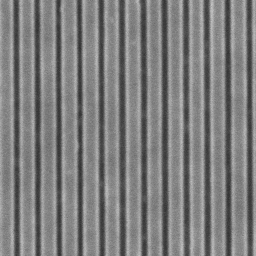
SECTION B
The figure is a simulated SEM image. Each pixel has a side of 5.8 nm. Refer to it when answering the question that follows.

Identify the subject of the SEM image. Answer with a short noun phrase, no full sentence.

parallel lines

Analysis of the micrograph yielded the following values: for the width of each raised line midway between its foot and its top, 81.2 nm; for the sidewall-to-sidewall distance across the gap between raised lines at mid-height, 40.6 nm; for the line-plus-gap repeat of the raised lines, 0.123 micrometres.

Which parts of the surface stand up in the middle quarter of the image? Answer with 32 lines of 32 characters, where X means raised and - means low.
XXX--XXX--XXX---XXX--XXX--XXXX--
XXX--XXX--XXX---XXX--XXX--XXXX--
XXX--XXX--XXX---XXX--XXX--XXXX--
XXX--XXX--XXX---XXX--XXX--XXXX--
XXX--XXX--XXX---XXX--XXX--XXXX--
XXX--XXX--XXX---XXX--XXX--XXXX--
XXX--XXX--XXX---XXX--XXX--XXXX--
XXX--XXX--XXX---XXX--XXX--XXXX--
XXX--XXX--XXX---XXX--XXX--XXXX--
XXX--XXX--XXX---XXX--XXX--XXXX--
XXX--XXX--XXX---XXX--XXX--XXXX--
XXX--XXX--XXX---XXX--XXX--XXXX--
XXX--XXX--XXX---XXX--XXX--XXXX--
XXX--XXX--XXX---XXX--XXX--XXXX--
XXX--XXX--XXX---XXX--XXX--XXXX--
XXX--XXX--XXX---XXX--XXX--XXXX--
XXX--XXX--XXX---XXX--XXX--XXXX--
XXX--XXX--XXX---XXX--XXX--XXXX--
XXX--XXX--XXX---XXX--XXX--XXXX--
XXX--XXX--XXX---XXX--XXX--XXXX--
XXX--XXX--XXX---XXX--XXX--XXXX--
XXX--XXX--XXX---XXX--XXX--XXXX--
XXX--XXX--XXXX--XXX--XXX--XXXX--
XXX--XXX--XXXX--XXX--XXX--XXXX--
XXX--XXXX-XXXX--XXX--XXX--XXXX--
XXX--XXXX-XXXX--XXX--XXX--XXXX--
XXX--XXXX-XXXX--XXX--XXX--XXXX--
XXX--XXXX--XXX--XXX--XXX--XXXX--
XXX--XXXX--XXX--XXX--XXX--XXXX--
XXX--XXXX--XXX--XXX--XXX--XXXX--
XXX--XXXX--XXX--XXX--XXX--XXXX--
XXX--XXXX--XXX--XXX--XXX--XXXX--